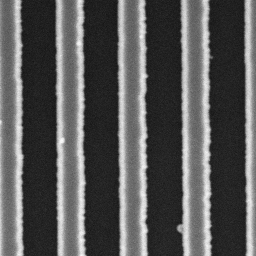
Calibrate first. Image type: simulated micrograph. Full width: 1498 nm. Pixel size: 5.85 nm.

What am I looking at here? lines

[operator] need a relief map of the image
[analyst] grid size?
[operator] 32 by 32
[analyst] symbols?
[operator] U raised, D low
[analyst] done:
UUUDDDDUUUDDDDDUUUDDDDDUUUDDDDDU
UUDDDDDUUUDDDDDUUUDDDDDUUUDDDDDU
UUUDDDDUUUDDDDDUUUDDDDDUUUDDDDDU
UUUDDDDUUUDDDDDUUUDDDDDUUUDDDDDU
UUDDDDDUUUDDDDDUUUDDDDDUUUDDDDDU
UUUDDDDUUUDDDDDUUUDDDDDUUUDDDDDU
UUUDDDDUUUDDDDDUUUDDDDDUUUDDDDDU
UUUDDDDUUUDDDDDUUUDDDDDUUUDDDDDU
UUUDDDDUUUDDDDDUUUDDDDDUUUDDDDDU
UUUDDDDUUUDDDDDUUUDDDDDUUUDDDDDU
UUUDDDDUUUDDDDDUUUDDDDDUUUDDDDDU
UUUDDDDUUUDDDDDUUUDDDDDUUUDDDDDU
UUUDDDDUUUDDDDDUUUDDDDDUUUDDDDDU
UUUDDDDUUUDDDDDUUUDDDDDUUUDDDDDU
UUUDDDDUUUDDDDDUUUDDDDDUUUDDDDDU
UUUDDDDUUUDDDDDUUUDDDDDUUUDDDDDU
UUUDDDDUUUDDDDDUUUDDDDDUUUDDDDDU
UUUDDDDUUUDDDDDUUUDDDDDUUUDDDDDU
UUUDDDDUUUDDDDDUUUDDDDDUUUDDDDDU
UUUDDDDUUUDDDDDUUUDDDDDUUUDDDDDU
UUUDDDDUUUDDDDDUUUDDDDDUUUDDDDDU
UUUDDDDUUUDDDDDUUUDDDDDUUUDDDDDU
UUUDDDDUUUUDDDDUUUDDDDDUUUDDDDDU
UUUDDDDUUUDDDDDUUUDDDDDUUUDDDDDU
UUUDDDDUUUDDDDDUUUDDDDDUUUDDDDDU
UUUDDDDUUUUDDDDUUUDDDDDUUUDDDDDU
UUUDDDDUUUDDDDDUUUDDDDDUUUDDDDDU
UUUDDDDUUUDDDDDUUUDDDDDUUUDDDDDU
UUUDDDDUUUDDDDDUUUDDDDDUUUDDDDDU
UUUDDDDUUUDDDDDUUUDDDDDUUUDDDDDU
UUUDDDDUUUDDDDDUUUDDDDDUUUDDDDDU
UUUDDDDUUUUDDDDUUUDDDDDUUUDDDDDU